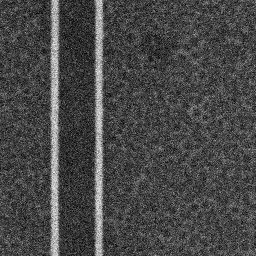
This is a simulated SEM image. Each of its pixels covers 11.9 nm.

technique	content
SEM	one or a few lines or trenches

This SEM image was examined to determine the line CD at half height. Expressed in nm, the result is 532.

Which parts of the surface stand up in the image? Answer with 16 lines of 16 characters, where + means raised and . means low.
...+++..........
...+++..........
...+++..........
...+++..........
...+++..........
...+++..........
...+++..........
...+++..........
...+++..........
...+++..........
...+++..........
...+++..........
...+++..........
...+++..........
...+++..........
...+++..........